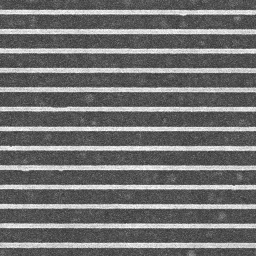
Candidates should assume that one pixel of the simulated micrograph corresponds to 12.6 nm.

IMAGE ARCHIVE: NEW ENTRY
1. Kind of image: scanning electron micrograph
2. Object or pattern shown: parallel lines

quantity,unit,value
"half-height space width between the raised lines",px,15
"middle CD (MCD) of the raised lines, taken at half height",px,4.38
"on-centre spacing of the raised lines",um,0.244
